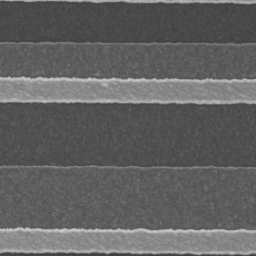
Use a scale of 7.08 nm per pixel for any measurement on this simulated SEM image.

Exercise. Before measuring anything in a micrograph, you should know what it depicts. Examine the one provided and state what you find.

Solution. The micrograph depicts lines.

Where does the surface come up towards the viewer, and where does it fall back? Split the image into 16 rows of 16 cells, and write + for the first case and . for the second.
................
................
................
++++++++++++++++
++++++++++++++++
++++++++++++++++
................
................
................
................
++++++++++++++++
++++++++++++++++
++++++++++++++++
++++++++++++++++
++++++++++++++++
++++++++++++++++